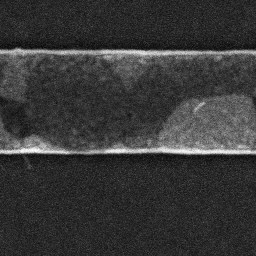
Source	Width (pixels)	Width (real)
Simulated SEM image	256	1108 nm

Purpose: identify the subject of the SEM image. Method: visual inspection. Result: one or a few lines or trenches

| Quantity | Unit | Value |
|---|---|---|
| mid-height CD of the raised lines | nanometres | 441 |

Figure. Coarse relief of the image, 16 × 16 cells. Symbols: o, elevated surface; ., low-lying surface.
................
................
................
oooooooooooooooo
oooooooooooooooo
oooooooooooooooo
oooooooooooooooo
oooooooooooooooo
oooooooooooooooo
oo.ooo....oooooo
................
................
................
................
................
................